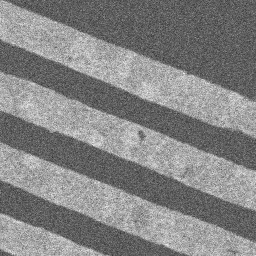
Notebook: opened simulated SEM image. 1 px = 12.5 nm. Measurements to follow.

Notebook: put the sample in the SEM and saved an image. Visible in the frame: one or a few lines or trenches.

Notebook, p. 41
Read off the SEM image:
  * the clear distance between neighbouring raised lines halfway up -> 0.379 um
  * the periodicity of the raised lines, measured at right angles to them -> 818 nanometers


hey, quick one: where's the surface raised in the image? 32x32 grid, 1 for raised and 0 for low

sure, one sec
10000000000000000000000000000000
11110000000000000000000000000000
11111100000000000000000000000000
11111111100000000000000000000000
11111111111000000000000000000000
00111111111111000000000000000000
00001111111111111000000000000000
00000001011111111110000000000000
00000000011111111111110000000000
10000000000011111111111100000000
11110000000000111111111111100000
10111110000000001111111111111000
11111011100000000001111111111110
11111111111000000000011111111111
00111111111110000000000011111111
00001111111111011000000000111111
00000000111111111010000000000001
00000000001111111011110000000000
10000000000001111111111100000000
10110000000000011111111111100000
11111110000000000011111111111000
11111111100000000000111011111111
10111111111100000000000111111111
00011111111111000000000011111111
00000110011111111000000000011111
00000001111111111110000000000011
00000000001111111111110000000000
11000000000011111111111110000000
11111000000000011111111111110000
11111110000000000111111111111000
11111111100000000000111111111111
01111111111100000000000111110011